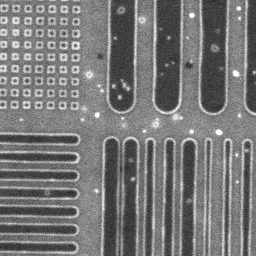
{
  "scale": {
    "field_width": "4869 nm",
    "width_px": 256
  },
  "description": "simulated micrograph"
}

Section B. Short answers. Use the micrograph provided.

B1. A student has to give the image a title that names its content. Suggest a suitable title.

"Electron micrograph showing groups of lines, slits or small figures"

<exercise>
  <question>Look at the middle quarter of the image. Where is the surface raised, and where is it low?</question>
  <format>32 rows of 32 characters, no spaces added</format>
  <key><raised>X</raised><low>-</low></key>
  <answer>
-----------XXXXXXX-----XXXXXX---
--X--------XXXXXXX-----XXXXXX---
-----------XXXXXXX-----XXXXXX---
-----------XXXXXXX-----XXXXXX---
--X--------XXXXXXX-----XXXXXX---
-----------XXXXXXX-----XXXXXX---
-----------XXXXXXX----XXXXXXX---
--X--------XXXXXXX----XXXXXXX---
-----------XXXXXXX----XXXXXXX---
-----------XXXXXXX----XXXXXXX---
--X--------XXXXXX------XXXXXX---
------------XXXXX------XXXXX----
--------------------------------
--------------------------------
--------------------------------
--------------------------------
--------------------------------
--------------------------------
XXXX-------XX---X---------------
XXXX------XXXX-XXX---XX--XXX--XX
----------XXXX-XXXX--XX--XXX--XX
----------XXXX-XXXX--XX--XXX-XXX
XXX-------XXXX-XXXX-XXX--XX--XXX
XXX-------XXXX-XXXX-XX---XX--XXX
XXX-------XXXX-XXXX-XX---XX--XXX
----------XXXX-XXXX-XX---XX--XXX
----------XXXX-XXXX-XX---XX--XXX
XXX-------XXXX-XXXX-XX---XX--XXX
XXX-------XXXX-XXXX-XX---XX--XXX
----------XXXX-XXXX-XX---XX--XXX
----------XXXX-XXX--XX---XX--XXX
XXX-------XXX--XXX--XX---XX--XXX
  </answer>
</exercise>